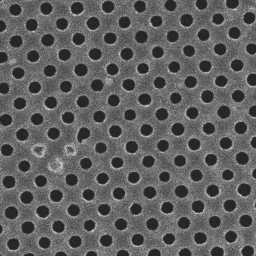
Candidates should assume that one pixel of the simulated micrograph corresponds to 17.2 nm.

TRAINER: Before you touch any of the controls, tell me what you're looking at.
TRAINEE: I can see a regular array of holes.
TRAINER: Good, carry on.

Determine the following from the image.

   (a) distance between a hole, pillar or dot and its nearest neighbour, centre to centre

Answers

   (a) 370 nm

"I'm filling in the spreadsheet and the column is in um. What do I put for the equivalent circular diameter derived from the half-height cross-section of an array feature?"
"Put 0.217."